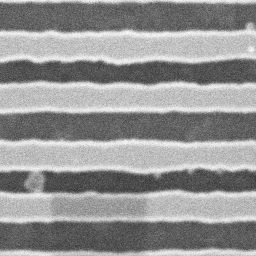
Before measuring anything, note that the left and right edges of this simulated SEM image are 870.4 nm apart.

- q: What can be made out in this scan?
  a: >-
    lines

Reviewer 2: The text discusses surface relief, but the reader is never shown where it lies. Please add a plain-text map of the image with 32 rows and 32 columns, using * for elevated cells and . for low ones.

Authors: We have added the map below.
................................
................................
................................
................................
********************************
********************************
********************************
**..******.*****************....
................................
................................
.***********..***...****......**
********************************
********************************
********************************
................................
................................
................................
................................
********************************
********************************
********************************
................***.............
................................
................................
********************************
********************************
********************************
***********************.*******.
................................
................................
................................
****......*........*************